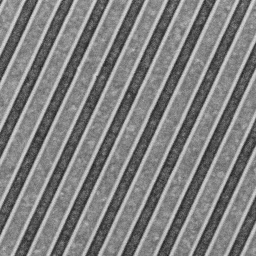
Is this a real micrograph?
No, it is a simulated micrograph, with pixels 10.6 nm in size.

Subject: parallel lines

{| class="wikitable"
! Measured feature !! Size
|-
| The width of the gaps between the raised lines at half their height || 145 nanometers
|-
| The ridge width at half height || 197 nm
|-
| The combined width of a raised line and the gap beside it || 342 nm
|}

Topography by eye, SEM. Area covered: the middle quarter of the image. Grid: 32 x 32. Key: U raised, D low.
DDDDUUUUUDDDDUUUUUDDDDUUUUUDDDDU
DDDDUUUUUDDDDUUUUUDDDUUUUUUDDDUU
DDDUUUUUDDDDUUUUUDDDDUUUUUDDDDUU
DDDUUUUUDDDDUUUUUDDDDUUUUUDDDUUU
DDUUUUUDDDDUUUUUDDDDUUUUUDDDDUUU
DDUUUUUDDDDUUUUUDDDDUUUUUDDDDUUU
DUUUUUDDDDUUUUUDDDDUUUUUDDDDUUUU
DUUUUUDDDDUUUUUDDDDUUUUUDDDDUUUU
UUUUUDDDDUUUUUDDDDUUUUUDDDDUUUUU
UUUUUDDDDUUUUUDDDDUUUUUDDDDUUUUU
UUUUUDDDUUUUUDDDDUUUUUDDDDUUUUUD
UUUUDDDDUUUUUDDDDUUUUUDDDDUUUUUD
UUUUDDDUUUUUDDDDUUUUUDDDDUUUUUDD
UUUDDDDUUUUUDDDDUUUUUDDDDUUUUUDD
UUUDDDDUUUUUDDDUUUUUDDDDUUUUUDDD
UUDDDDUUUUUDDDDUUUUUDDDDUUUUUDDD
UUDDDDUUUUUDDDDUUUUUDDDUUUUUDDDD
UDDDDUUUUUDDDDUUUUUDDDDUUUUUDDDD
UDDDDUUUUUDDDDUUUUUDDDDUUUUUDDDU
DDDDUUUUUDDDDUUUUUDDDDUUUUUDDDDU
DDDDUUUUUDDDDUUUUUDDDDUUUUUDDDDU
DDDUUUUUDDDDUUUUUDDDDUUUUUDDDDUU
DDDUUUUUDDDDUUUUUDDDDUUUUUDDDDUU
DDUUUUUDDDDUUUUUDDDDUUUUUDDDDUUU
DDUUUUUDDDDUUUUUDDDDUUUUUDDDDUUU
DUUUUUDDDDUUUUUDDDDUUUUUDDDDUUUU
DUUUUUDDDDUUUUUDDDDUUUUUDDDDUUUU
UUUUUUDDDUUUUUDDDDUUUUUDDDDUUUUU
UUUUUDDDDUUUUUDDDDUUUUUDDDDUUUUU
UUUUUDDDUUUUUUDDDUUUUUDDDDUUUUUD
UUUUDDDDUUUUUDDDDUUUUUDDDDUUUUUD
UUUUDDDDUUUUUDDDUUUUUUDDDUUUUUDD